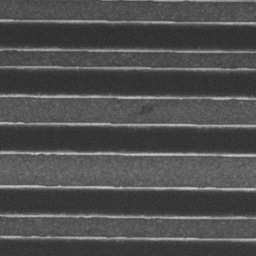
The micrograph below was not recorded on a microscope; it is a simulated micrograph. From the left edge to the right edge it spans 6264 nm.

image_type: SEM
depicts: lines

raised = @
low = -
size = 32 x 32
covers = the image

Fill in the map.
--------------------------------
--------------------------------
--------------------------------
@@@@@@@@@@@@@@@@@@@@@@@@@@@@@@@@
@@@@@@@@@@@@@@@@@@@@@@@@@@@@@@@@
@@@@@@@@@@@@@@@@@@@@@@@@@@@@@@@@
----------------------@@@@@@@@@@
--------------------------------
@@@@@@@@@@@@@@@@@@@-------------
@@@@@@@@@@@@@@@@@@@@@@@@@@@@@@@@
@@@@@@@@@@@@@@@@@@@@@@@@@@@@@@@@
@@@@@@@@@@@@@@@@@@@@@@@@@@@@@@@@
--------------------------------
--------------------------------
--------------------------------
@@@@@@@@@@@@@@------------------
@@@@@@@@@@@@@@@@@@@@@@@@@@@@@@@@
@@@@@@@@@@@@@@@@@@@@@@@@@@@@@@@@
@@@@@@@@@@@@@@@@@@@@@@@@@@@@@@@@
--------------------------------
--------------------------------
--------------------------------
--------------------------------
@@@@@@@@@@@@@@@-----------------
@@@@@@@@@@@@@@@@@@@@@@@@@@@@@@@@
@@@@@@@@@@@@@@@@@@@@@@@@@@@@@@@@
@@@@@@@@@@@@@@@@@@@@@@@@@@@@@@@@
--------------------------------
--------------------------------
--------------------------------
@@@@@@@@@@@@@@@@@@@@@@@@@@@@@@@@
@@@@@@@@@@@@@@@@@@@@@@@@@@@@@@@@